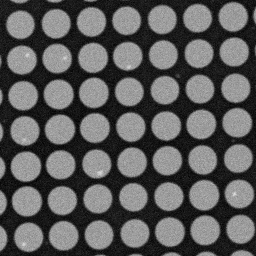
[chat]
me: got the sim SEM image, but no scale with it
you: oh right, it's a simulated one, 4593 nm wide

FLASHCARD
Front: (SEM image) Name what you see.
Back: an array of small figures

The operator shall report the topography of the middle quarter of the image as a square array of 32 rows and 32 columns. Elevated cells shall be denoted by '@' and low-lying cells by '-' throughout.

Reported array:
@---@@@@@@---@@@@@-----@@@@-----
-----@@@@-----------------------
--------------------------------
------------------------@@@-----
-----@@@@@----@@@@@---@@@@@@---@
@@--@@@@@@@--@@@@@@---@@@@@@@--@
@@--@@@@@@@--@@@@@@@--@@@@@@@--@
@@--@@@@@@@--@@@@@@@--@@@@@@@--@
@@--@@@@@@@--@@@@@@---@@@@@@---@
@@---@@@@@----@@@@@----@@@@-----
@-----@@@-----------------------
--------------------------------
-------@@------@@@------@@@@----
@----@@@@@----@@@@@----@@@@@@--@
@@--@@@@@@@--@@@@@@@--@@@@@@@--@
@@@-@@@@@@@--@@@@@@@--@@@@@@@--@
@@@-@@@@@@@--@@@@@@@--@@@@@@@--@
@@--@@@@@@@---@@@@@@---@@@@@@---
@@---@@@@@-----@@@@-----@@@-----
@------@@-----------------------
--------------------------------
---------------@@@@-----@@@@----
@@----@@@@@---@@@@@@---@@@@@@--@
@@---@@@@@@---@@@@@@--@@@@@@@--@
@@@--@@@@@@@--@@@@@@@-@@@@@@@--@
@@@--@@@@@@@--@@@@@@---@@@@@@---
@@@--@@@@@@---@@@@@@---@@@@@@---
@@----@@@@@----@@@@------@@-----
--------------------------------
--------------------------------
-------@@@-----@@@@-----@@@@----
@@----@@@@@---@@@@@@---@@@@@@---